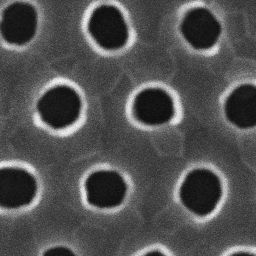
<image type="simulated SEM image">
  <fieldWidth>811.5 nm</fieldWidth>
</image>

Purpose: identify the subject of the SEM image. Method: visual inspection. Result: holes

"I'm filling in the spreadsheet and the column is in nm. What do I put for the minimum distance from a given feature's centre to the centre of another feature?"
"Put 292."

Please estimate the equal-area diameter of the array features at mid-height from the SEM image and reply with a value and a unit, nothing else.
0.131 micrometres